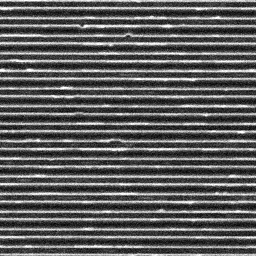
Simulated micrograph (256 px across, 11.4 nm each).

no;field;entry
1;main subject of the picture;parallel lines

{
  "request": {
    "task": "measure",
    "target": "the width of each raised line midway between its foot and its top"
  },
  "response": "0.123 µm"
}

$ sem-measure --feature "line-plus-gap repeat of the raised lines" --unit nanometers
201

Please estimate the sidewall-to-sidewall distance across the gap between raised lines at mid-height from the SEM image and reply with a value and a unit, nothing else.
72.9 nm